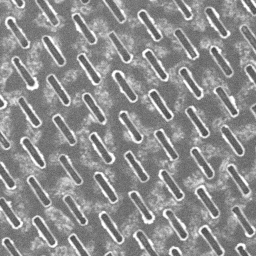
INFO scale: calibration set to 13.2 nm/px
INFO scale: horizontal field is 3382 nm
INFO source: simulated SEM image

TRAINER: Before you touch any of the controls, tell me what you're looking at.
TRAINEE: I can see a regular array of holes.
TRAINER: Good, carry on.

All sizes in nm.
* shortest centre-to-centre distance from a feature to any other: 491